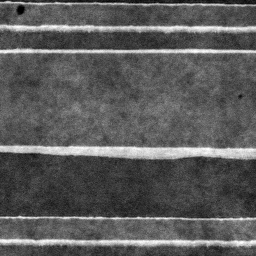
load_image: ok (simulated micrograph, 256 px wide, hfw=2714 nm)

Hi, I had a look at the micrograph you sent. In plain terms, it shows lines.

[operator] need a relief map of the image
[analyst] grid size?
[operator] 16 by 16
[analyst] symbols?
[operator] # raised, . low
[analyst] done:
################
################
################
################
################
################
################
################
################
................
................
................
................
................
################
################